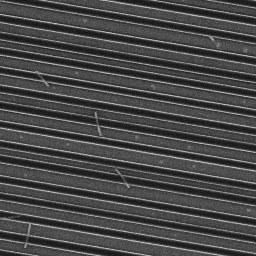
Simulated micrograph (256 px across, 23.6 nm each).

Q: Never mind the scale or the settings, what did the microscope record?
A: parallel lines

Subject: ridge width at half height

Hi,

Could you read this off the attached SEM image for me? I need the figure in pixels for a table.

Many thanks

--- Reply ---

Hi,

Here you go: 8.38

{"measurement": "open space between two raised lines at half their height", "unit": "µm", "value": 0.242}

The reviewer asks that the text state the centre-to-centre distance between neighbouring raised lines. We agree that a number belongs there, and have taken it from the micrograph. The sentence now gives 0.423 µm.